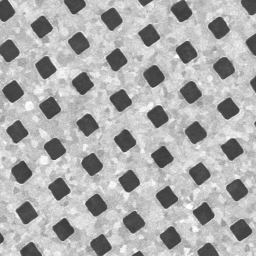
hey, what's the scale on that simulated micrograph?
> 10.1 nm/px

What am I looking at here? a regular array of holes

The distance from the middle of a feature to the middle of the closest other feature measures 0.406 micrometres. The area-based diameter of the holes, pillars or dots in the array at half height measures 202 nm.